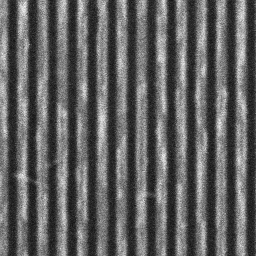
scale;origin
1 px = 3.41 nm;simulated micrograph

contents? parallel lines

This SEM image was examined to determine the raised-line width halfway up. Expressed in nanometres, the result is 32.4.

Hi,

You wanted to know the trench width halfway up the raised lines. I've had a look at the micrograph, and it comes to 35 nanometers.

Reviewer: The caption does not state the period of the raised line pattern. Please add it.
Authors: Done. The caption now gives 67.8 nanometers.